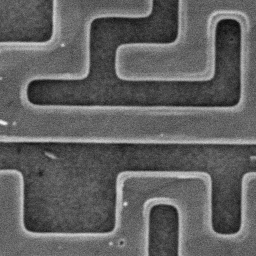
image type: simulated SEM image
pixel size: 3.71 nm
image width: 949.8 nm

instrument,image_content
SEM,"wiring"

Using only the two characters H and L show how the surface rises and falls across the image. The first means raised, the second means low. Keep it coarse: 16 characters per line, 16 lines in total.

LLLHHHHHHLLHHHHH
LLLHHHLLLLLHHHLH
LLLHHHLLLLLHHLLH
HHHHHHLHHHHHHLLH
HHHHHLLHHHHHHLLH
HHLLLLLLLLLLLLLH
HHLLLLLLLLLLLLLH
HHHHHHHHHHHHHHHH
HHHHHHHHHHHHHHHH
LLLLLLLLLLLLLLLL
LLLLLLLLLLLLLLLL
HLLLLLLHHHHHHLLH
HLLLLLLHHHHHHLLH
HLLLLLLHHLLHHLLH
HHLLLLLHHLLHHHLH
HHHHHHHHHLLHHHHH